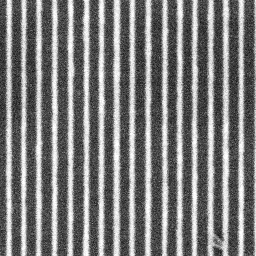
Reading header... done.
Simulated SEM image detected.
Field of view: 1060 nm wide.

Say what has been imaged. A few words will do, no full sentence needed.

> parallel lines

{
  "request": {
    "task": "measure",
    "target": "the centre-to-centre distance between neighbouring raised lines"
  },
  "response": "64.1 nm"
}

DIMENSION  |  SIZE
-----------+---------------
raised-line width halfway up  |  16.6 nm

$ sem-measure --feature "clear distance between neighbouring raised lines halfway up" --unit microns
0.0456